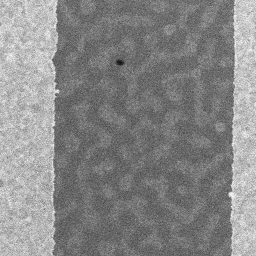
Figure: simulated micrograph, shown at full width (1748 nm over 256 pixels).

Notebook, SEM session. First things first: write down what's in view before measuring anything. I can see one or a few lines or trenches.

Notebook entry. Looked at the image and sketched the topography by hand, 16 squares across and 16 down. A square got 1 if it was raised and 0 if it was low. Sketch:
1111000000000001
1110000000000001
1111000000000001
1110000000000001
1110000000000001
1110000000000001
1110000000000001
1110000000000001
1110000000000001
1110000000000001
1110000000000001
1110000000000001
1110000000000011
1110000000000011
1110000000000001
1110000000000001